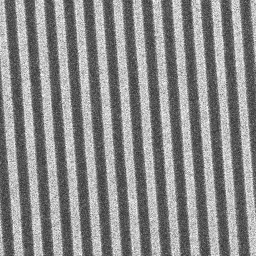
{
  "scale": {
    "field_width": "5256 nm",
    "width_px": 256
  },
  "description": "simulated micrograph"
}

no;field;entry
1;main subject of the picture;parallel lines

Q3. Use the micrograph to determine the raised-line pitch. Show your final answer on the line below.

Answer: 401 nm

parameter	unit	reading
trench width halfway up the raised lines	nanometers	197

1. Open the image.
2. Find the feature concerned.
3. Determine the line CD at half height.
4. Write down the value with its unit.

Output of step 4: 194 nm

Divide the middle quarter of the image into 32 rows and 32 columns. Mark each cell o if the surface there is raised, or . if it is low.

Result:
o...oo...oo...oo..ooo..ooo..oo..
o...oo...oo...oo..ooo..ooo..ooo.
o...oo...oo...oo..ooo..ooo..ooo.
o...oo...oo...oo...oo...oo...oo.
o...oo...oo...oo...oo...oo...oo.
o...oo...oo...oo...oo...oo...oo.
o...oo...oo...oo...oo...oo...oo.
oo..ooo..oo...oo...oo...oo...oo.
oo..ooo..ooo..oo...oo...oo...oo.
oo..ooo..ooo..oo...oo...oo...oo.
oo...oo..ooo..oo...oo...oo...oo.
oo...oo..ooo..ooo..ooo..oo...oo.
oo...oo..ooo..ooo..ooo..oo...oo.
oo...oo...oo...oo..ooo..oo...oo.
oo...oo...oo...oo..ooo..ooo..ooo
oo...oo...oo...oo..ooo..ooo..ooo
oo...oo...oo...oo...oo...oo..ooo
oo...oo...oo...oo...oo...oo...oo
oo...oo...oo...oo...oo...oo...oo
oo...oo...oo...oo...oo...oo...oo
ooo..oo...oo...oo...oo...oo...oo
ooo..ooo..oo...oo...oo...oo...oo
ooo..ooo..ooo..oo...oo...oo...oo
.oo..ooo..ooo..oo...oo...oo...oo
.oo...oo..ooo..ooo..oo...oo...oo
.oo...oo..ooo..ooo..oo...oo...oo
.oo...oo...oo...oo..oo...oo...oo
.oo...oo...oo...oo..ooo..ooo..oo
.oo...oo...oo...oo..ooo..ooo..oo
.oo...oo...oo...oo...oo..ooo..oo
.oo...oo...oo...oo...oo...oo...o
.oo...oo...oo...oo...oo...oo...o